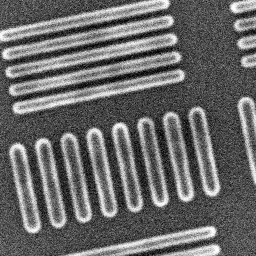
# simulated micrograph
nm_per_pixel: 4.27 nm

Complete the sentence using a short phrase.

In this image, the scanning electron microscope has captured groups of lines, slits or small figures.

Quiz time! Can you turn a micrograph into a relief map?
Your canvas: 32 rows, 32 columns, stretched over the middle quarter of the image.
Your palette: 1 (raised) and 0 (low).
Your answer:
00000000000111111111111100000000
00000011111111111100000000000000
00111111111111000000000011111100
11111111100000000000111111111100
11100000000000111111111111100000
00000000001111111111100000000000
00000111111111111000000000000000
01111111111000000000000000000000
11111110000000000000000000000000
10000000000000000000000000000000
00000000000000000000000000000000
00000000000000000000000000000000
00000000000000000000000000110001
00000000000000000000000001111001
00000000000000000001110001111000
00000000000001100001110001111000
00000001000011110001111001111000
00000011100011110001111000111000
11100011100001110001111000111100
11100011110001110001111000111100
11100011110001111001111000111100
11110011110001111000111000111100
11110001110001111000111100011100
11110001110000111000111100011100
11110001111000111000011100011110
01110001111000111000011100011110
01110001111000111100011100001110
01111000111000011100011110001110
01111000111000011100011110001110
00111000111100011100011110001110
00111000111100011110001110000111
00111000011100011110001110000111